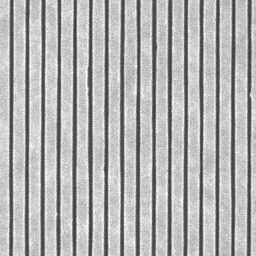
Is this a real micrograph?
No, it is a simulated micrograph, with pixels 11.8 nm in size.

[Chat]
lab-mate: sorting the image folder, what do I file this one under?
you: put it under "parallel lines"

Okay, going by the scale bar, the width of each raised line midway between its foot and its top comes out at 140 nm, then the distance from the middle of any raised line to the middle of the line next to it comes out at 15.9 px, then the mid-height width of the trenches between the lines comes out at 48.7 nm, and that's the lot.